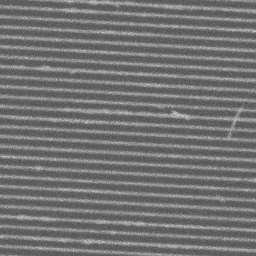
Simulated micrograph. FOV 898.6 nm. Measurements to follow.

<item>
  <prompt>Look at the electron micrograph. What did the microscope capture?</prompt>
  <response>parallel lines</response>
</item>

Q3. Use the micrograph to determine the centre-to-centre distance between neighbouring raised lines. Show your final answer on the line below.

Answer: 35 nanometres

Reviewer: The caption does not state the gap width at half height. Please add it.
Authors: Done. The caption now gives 24.1 nanometers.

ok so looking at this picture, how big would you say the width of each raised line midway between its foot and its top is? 0.0092 µm